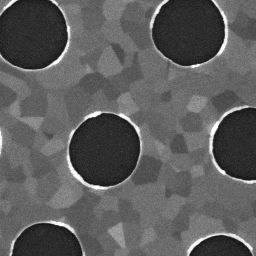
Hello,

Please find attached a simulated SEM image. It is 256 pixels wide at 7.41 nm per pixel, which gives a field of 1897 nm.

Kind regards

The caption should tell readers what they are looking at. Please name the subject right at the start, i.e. holes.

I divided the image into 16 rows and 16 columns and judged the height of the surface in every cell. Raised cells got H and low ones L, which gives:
LLLLHHHHHHLLLLHH
LLLLHHHHHHLLLLHH
LLLLHHHHHHLLLLHH
LLLLHHHHHHLLLHHH
HHHHHHHHHHHHHHHH
HHHHHHHHHHHHHHHH
HHHHHHHHHHHHHHHH
HHHHHLLLHHHHHHLL
HHHHHLLLLHHHHLLL
HHHHLLLLLHHHHLLL
HHHHHLLLHHHHHHLL
HHHHHHLHHHHHHHHH
HHHHHHHHHHHHHHHH
HHHHHHHHHHHHHHHH
HLLLHHHHHHHHHHHH
HLLLLHHHHHHHLLLH